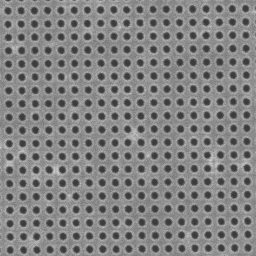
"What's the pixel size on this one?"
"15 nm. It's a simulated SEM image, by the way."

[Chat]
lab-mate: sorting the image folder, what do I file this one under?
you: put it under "a regular array of holes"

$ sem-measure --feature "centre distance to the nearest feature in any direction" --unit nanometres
194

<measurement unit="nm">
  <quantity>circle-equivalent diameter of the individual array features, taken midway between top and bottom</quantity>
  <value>111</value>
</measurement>